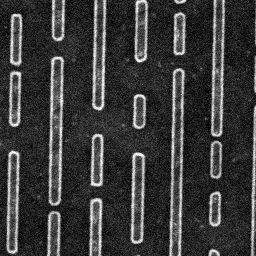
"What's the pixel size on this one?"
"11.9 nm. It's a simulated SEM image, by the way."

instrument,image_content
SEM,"parallel lines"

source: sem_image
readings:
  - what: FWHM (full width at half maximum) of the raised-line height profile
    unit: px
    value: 9.13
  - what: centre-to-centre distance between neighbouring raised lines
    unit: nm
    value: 483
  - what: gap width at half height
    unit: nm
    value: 381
